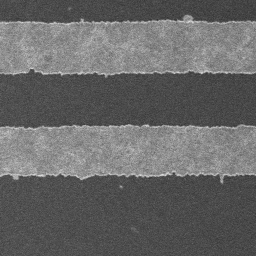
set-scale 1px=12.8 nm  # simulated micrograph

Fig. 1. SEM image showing one or a few lines or trenches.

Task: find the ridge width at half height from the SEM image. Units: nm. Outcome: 628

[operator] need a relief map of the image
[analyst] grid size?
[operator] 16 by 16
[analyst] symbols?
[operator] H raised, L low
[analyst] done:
LLLLLLLLLLLLLLLL
HHHHHHHHHHHHHHHH
HHHHHHHHHHHHHHHH
HHHHHHHHHHHHHHHH
HHLHHHHHHHHHHHHH
LLLLLLLLLLLLLLLL
LLLLLLLLLLLLLLLL
LLLLLLLLLLLLLLLL
HHHHHHHHHHHHHHHH
HHHHHHHHHHHHHHHH
HHHHHHHHHHHHHHHH
LLLLLLLLLLLLLLLL
LLLLLLLLLLLLLLLL
LLLLLLLLLLLLLLLL
LLLLLLLLLLLLLLLL
LLLLLLLLLLLLLLLL